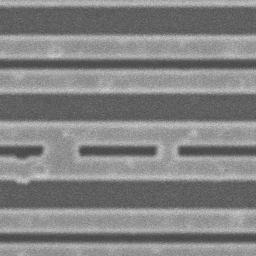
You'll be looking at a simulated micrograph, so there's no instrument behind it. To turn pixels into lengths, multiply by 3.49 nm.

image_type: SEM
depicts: parallel lines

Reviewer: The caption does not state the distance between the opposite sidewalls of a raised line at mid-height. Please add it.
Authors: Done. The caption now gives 0.0833 micrometres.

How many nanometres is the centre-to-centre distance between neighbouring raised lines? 151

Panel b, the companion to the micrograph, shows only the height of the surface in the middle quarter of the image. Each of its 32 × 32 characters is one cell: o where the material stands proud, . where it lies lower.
................................
................................
oooooooooooooooooooooooooooooooo
oooooooooooooooooooooooooooooooo
oooooooooooooooooooooooooooooooo
oooooooooooooooooooooooooooooooo
oooooooooooooooooooooooooooooooo
................................
................................
................................
................................
................................
................................
................................
................................
oooooooooooooooooooooooooooooooo
oooooooooooooooooooooooooooooooo
oooooooooooooooooooooooooooooooo
oooooooooooooooooooooooooooooooo
oooooooooooooooooooooooooooooooo
oooo...................oooooo...
oooo...................ooooo....
oooo...................oooooo...
oooooooooooooooooooooooooooooooo
oooooooooooooooooooooooooooooooo
oooooooooooooooooooooooooooooooo
oooooooooooooooooooooooooooooooo
oooooooooooooooooooooooooooooooo
oooooooooooooooooooooooooooooooo
................................
................................
................................